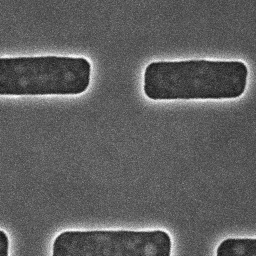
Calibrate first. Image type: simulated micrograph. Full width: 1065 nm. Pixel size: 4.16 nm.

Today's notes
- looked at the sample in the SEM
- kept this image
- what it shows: holes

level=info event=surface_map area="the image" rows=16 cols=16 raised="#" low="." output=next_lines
################
################
################
################
......###......#
.....####......#
################
################
################
################
################
################
################
################
####......######
.##........###..